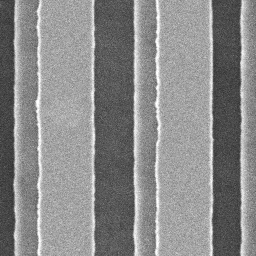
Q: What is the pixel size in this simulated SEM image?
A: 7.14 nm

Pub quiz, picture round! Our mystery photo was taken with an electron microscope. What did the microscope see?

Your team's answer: lines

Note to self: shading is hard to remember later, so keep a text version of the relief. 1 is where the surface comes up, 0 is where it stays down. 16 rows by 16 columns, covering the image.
0111110011111001
0111110011111001
0111110011111001
0111110011111001
0111110011111001
0111110011111001
0111110011111001
0111110011111001
0111110011111001
0111110011111001
0111110011111001
0111110011111001
0111110011111001
0111110011111001
0111110011111001
0111110011111001